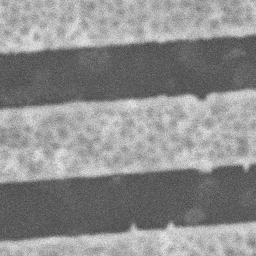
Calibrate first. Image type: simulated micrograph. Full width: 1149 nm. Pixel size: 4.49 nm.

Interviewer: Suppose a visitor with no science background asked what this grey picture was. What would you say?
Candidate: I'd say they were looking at one or a few lines or trenches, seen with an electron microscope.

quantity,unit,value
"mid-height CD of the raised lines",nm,295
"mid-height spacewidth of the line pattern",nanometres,292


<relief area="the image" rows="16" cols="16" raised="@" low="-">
@@@@@@@@@@@@@@@@
@@@@@@@@@@@@@@@@
@@@@@@@@--------
----------------
----------------
----------------
--------@@@@@@@@
@@@@@@@@@@@@@@@@
@@@@@@@@@@@@@@@@
@@@@@@@@@@@@@@@@
@@@@@@@@@-------
----------------
----------------
----------------
----------@@@@@@
@@@@@@@@@@@@@@@@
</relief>